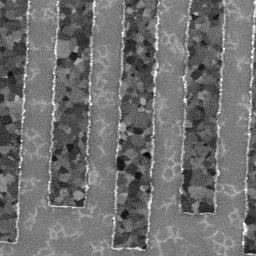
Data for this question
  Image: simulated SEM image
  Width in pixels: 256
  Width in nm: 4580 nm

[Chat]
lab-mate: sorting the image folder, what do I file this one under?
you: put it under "one or a few lines or trenches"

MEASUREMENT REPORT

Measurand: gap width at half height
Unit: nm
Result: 543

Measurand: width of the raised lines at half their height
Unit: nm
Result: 634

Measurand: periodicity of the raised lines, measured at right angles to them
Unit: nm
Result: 1170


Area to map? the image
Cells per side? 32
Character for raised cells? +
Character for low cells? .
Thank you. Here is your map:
++++...+++++....++++....++++....
+++....+++++...+++++....++++....
+++....+++++...+++++....++++....
+++....+++++...+++++...+++++....
+++....+++++...+++++...+++++....
+++....++++....+++++...+++++....
+++....++++....+++++....++++....
+++....++++....+++++...+++++....
+++....++++....+++++...+++++...+
+++....++++....++++....+++++....
+++....++++....++++....+++++...+
+++....++++....++++....+++++...+
+++....++++....++++....++++....+
+++....++++....++++....++++....+
+++....++++....++++....++++....+
+++....++++....++++....++++....+
+++....++++....++++....++++....+
+++....++++....++++....++++....+
+++...+++++....++++....++++....+
+++...+++++....++++....++++....+
+++...+++++....++++....++++....+
+++...+++++....++++....++++....+
++....+++++....++++....++++....+
++....+++++...+++++....++++....+
++....+++++...+++++...+++++....+
++....+++++...+++++....++++....+
++............+++++....++++....+
++............+++++............+
++............+++++............+
++............++++............++
..............++++............++
...............................+